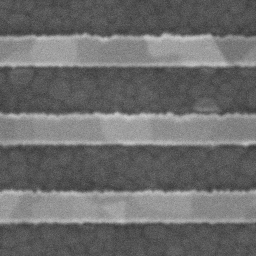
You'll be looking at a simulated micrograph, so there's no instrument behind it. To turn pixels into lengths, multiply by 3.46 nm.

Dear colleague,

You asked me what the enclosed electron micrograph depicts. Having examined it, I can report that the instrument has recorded lines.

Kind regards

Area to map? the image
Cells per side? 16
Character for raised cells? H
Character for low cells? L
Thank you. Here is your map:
LLLLLLLLLLLLLLLL
LLLLLLLLLLLLLLLL
HHHHHHHHHHHHHHHH
HHHHHHHHHHHHHHHH
LLLLLLLLLLLLLLLL
LLLLLLLLLLLLLLLL
LLLLLLLLLLLLLLLL
HHHHHHHHHHHHHHHH
HHHHHHHHHHHHHHHH
LLLLLLLLLLLLLLLL
LLLLLLLLLLLLLLLL
LLLLLLLLLLLLLLLL
HHHHHHHHHHHHHHHH
HHHHHHHHHHHHHHHH
LLLLLLLLLLLLLLLL
LLLLLLLLLLLLLLLL